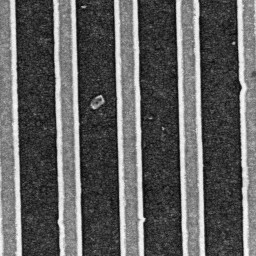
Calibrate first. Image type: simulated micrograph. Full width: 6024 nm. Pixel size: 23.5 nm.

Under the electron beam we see one or a few lines or trenches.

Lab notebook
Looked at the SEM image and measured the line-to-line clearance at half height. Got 1.01 µm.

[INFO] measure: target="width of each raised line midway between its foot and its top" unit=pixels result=17.9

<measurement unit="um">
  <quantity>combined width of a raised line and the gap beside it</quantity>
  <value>1.44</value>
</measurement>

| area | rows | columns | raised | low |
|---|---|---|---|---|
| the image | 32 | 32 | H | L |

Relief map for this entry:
HHLLLLLHHLLLLLLHHLLLLLHHHLLLLLHH
HHLLLLLHHLLLLLLHHLLLLLHHHLLLLLHH
HHLLLLLHHLLLLLLHHLLLLLHHHLLLLLHH
HHLLLLLHHLLLLLLHHLLLLLHHHLLLLLHH
HHLLLLLHHLLLLLLHHLLLLLHHHLLLLLHH
HHLLLLLHHLLLLLLHHLLLLLLHHLLLLLHH
HHLLLLLHHLLLLLLHHLLLLLLHHLLLLLHH
HHLLLLLHHLLLLLLHHLLLLLLHHLLLLLHH
HHLLLLLHHLLLLLLHHLLLLLLHHLLLLLHH
HHLLLLLHHLLLLLLHHLLLLLLHHLLLLLHH
HHLLLLLHHLLLLLLHHLLLLLLHHLLLLLHH
HHLLLLLHHLLLLLLHHLLLLLLHHLLLLLHH
HHLLLLLHHLLLLLLHHLLLLLLHHLLLLLHH
HHLLLLLHHLLLLLLHHLLLLLLHHLLLLLHH
HHLLLLLHHHLLLLLHHLLLLLLHHLLLLLHH
HHLLLLLHHHLLLLLHHLLLLLLHHLLLLLHH
HHLLLLLHHHLLLLLHHLLLLLLHHLLLLLHH
HHLLLLLHHHLLLLLHHLLLLLLHHLLLLLHH
HHLLLLLHHHLLLLLHHLLLLLLHHLLLLLHH
HHLLLLLHHHLLLLLHHLLLLLLHHLLLLLLH
HHLLLLLLHHLLLLLHHLLLLLLHHLLLLLLH
HHLLLLLLHHLLLLLHHLLLLLLHHLLLLLLH
HHLLLLLLHHLLLLLHHLLLLLLHHLLLLLLH
HHLLLLLLHHLLLLLHHLLLLLLHHLLLLLLH
HHLLLLLLHHLLLLLHHHLLLLLHHLLLLLLH
HHLLLLLLHHLLLLLHHHLLLLLHHLLLLLLH
HHLLLLLLHHLLLLLHHHLLLLLHHLLLLLLH
HHLLLLLLHHLLLLLHHHLLLLLHHLLLLLLH
HHLLLLLLHHLLLLLHHHLLLLLHHLLLLLLH
HHLLLLLLHHLLLLLHHHLLLLLHHLLLLLLH
HHLLLLLLHHLLLLLHHHLLLLLHHLLLLLLH
HHLLLLLLHHLLLLLHHHLLLLLHHLLLLLLH